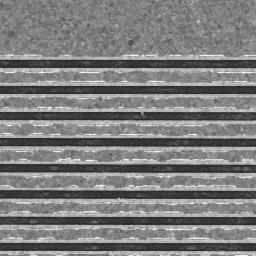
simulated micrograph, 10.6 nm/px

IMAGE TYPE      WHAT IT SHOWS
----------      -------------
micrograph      parallel lines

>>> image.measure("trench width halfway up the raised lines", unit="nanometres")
120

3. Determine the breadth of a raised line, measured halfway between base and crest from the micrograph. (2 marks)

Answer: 158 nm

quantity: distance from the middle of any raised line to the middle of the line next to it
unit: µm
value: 0.278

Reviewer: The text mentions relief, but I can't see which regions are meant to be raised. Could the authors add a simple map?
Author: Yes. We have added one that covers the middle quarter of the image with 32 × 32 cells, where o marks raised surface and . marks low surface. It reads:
................................
oooooooooooo....................
oooooooooooooooooooooooooooooooo
oooooooooooooooooooooooooooooooo
oooooooooooooooooooooooooooooooo
................................
................................
................................
oooooooooooooooooooooooooooooooo
oooooooooooooooooooooooooooooooo
oooooooooooooooooooooooooooooooo
........................oooooooo
................................
................................
................................
oooooooooooooooooooooooooooooooo
oooooooooooooooooooooooooooooooo
oooooooooooooooooooooooooooooooo
................................
................................
................................
oooooooooooooooooooooooooooooooo
oooooooooooooooooooooooooooooooo
oooooooooooooooooooooooooooooooo
oooooooooooooooooooooooooooooooo
................................
................................
................................
oooooooooooooooooooooooooooooooo
oooooooooooooooooooooooooooooooo
oooooooooooooooooooooooooooooooo
................................